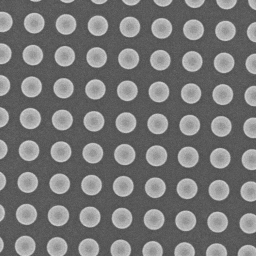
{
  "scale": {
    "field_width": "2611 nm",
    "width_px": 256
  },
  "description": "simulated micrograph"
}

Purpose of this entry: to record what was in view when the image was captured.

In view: an array of small figures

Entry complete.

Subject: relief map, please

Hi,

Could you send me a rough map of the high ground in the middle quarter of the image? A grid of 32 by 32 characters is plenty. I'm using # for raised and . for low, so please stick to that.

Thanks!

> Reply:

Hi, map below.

.......##.....####....####....##
.......................##......#
................................
................................
##....###......##...............
##....####....####....####....##
##....####...#####...#####...###
##....####...#####...#####...###
.......##.....####....####....##
..............................##
................................
................................
##....###.....###...............
##...#####...#####...####.....##
##...#####...#####...#####...###
##...#####...#####...#####...###
......###.....###....####....###
..............................##
................................
................................
#....####.....###.....#.........
##...#####...####....####....###
##...#####...#####...#####...###
#....####....#####...#####...###
......##.....####....####....###
..............................##
................................
................................
#....####....###................
#....####....####....####....###
#...#####...#####...#####...####
#....####...#####...#####...####